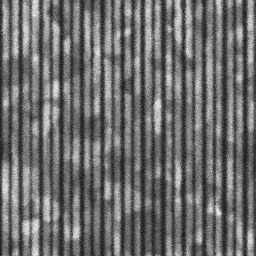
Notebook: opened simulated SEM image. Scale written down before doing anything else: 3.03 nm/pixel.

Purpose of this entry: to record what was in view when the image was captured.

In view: parallel lines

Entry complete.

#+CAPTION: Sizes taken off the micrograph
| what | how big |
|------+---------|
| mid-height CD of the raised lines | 14.4 nm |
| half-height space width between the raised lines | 14.4 nm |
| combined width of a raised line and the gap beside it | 0.0309 micrometres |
